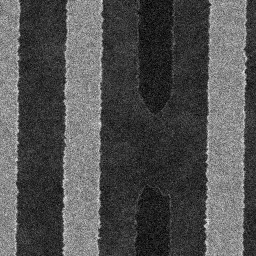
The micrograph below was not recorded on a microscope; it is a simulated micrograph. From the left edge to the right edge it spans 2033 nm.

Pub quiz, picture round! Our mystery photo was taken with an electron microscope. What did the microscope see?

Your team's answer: one or a few lines or trenches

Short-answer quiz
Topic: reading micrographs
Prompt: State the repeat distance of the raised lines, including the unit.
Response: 71.9 px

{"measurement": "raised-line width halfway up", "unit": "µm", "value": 0.279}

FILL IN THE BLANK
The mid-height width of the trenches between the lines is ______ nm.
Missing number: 308